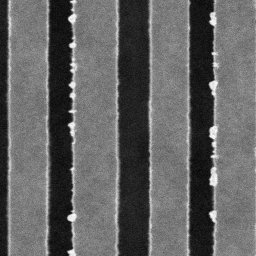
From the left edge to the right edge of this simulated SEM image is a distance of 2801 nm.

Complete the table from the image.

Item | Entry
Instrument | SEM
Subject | lines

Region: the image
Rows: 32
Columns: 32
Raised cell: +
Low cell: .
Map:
.+++++...++++++....+++++...+++++
.+++++...++++++....+++++...+++++
.+++++...++++++....+++++..++++++
.+++++...++++++....+++++...+++++
.+++++...++++++....+++++...+++++
.+++++...++++++....+++++...+++++
.+++++...++++++....+++++...+++++
.+++++...++++++....+++++...+++++
.+++++...++++++....+++++...+++++
.+++++...++++++....+++++...+++++
.+++++...++++++....+++++..++++++
.+++++...++++++....+++++...+++++
.+++++...++++++....+++++...+++++
.+++++...++++++....+++++...+++++
.+++++...++++++....+++++...+++++
.+++++...++++++....+++++...+++++
.+++++...++++++....+++++..++++++
.+++++...++++++....+++++...+++++
.+++++...++++++....+++++...+++++
.+++++...++++++....+++++...+++++
.+++++...++++++....+++++...+++++
.+++++...++++++....+++++..++++++
.+++++...++++++....+++++..++++++
.+++++...++++++....+++++...+++++
.+++++...++++++....+++++...+++++
.+++++...++++++....+++++...+++++
.+++++...++++++....+++++..++++++
.+++++...++++++....+++++...+++++
.+++++...++++++....+++++...+++++
.+++++...++++++....+++++...+++++
.+++++...++++++....++++....+++++
.+++++...++++++....+++++...+++++